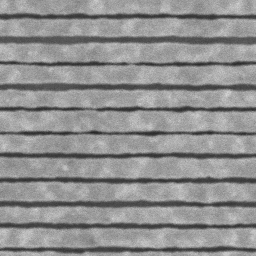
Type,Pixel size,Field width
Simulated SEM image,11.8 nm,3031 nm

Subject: parallel lines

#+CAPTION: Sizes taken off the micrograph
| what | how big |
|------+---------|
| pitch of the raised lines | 277 nanometres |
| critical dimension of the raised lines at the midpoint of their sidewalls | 215 nm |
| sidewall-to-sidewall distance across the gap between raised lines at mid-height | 5.13 pixels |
